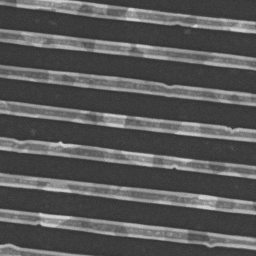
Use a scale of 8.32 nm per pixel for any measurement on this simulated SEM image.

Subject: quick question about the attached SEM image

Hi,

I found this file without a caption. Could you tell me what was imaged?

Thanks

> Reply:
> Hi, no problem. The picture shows parallel lines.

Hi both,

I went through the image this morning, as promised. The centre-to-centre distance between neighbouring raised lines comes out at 298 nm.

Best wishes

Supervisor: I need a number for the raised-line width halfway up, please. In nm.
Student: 81.2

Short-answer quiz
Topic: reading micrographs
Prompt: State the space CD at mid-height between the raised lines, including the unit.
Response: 0.221 microns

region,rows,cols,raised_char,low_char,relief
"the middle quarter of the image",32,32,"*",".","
................................
................................
*...............................
**********......................
********************............
.....********************.......
................****************
.........................*******
................................
................................
................................
**..............................
********........................
*****************...............
......********************......
...............*****************
.......................*********
................................
................................
................................
**..............................
***********.....................
******************..............
......*********************.....
...............*****************
........................********
................................
................................
................................
*...............................
*********.......................
******************..............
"